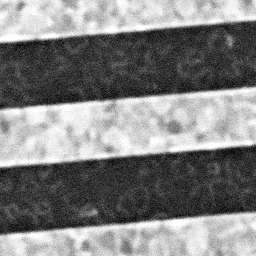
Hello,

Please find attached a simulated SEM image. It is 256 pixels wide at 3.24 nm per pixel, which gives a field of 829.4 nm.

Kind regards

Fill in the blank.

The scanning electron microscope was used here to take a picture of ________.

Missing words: one or a few lines or trenches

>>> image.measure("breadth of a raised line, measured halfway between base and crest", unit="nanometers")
176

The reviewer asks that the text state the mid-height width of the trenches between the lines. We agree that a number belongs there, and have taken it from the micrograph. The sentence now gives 227 nm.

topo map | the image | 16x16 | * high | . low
****************
************....
*...............
................
................
................
.....***********
****************
****************
**********......
................
................
................
..............**
...*************
****************